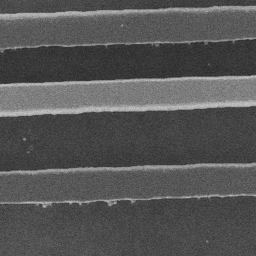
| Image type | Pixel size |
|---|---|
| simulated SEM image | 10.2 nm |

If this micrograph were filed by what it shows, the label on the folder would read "lines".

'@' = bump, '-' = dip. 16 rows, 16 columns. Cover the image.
-------------@@@
@@@@@@@@@@@@@@@@
@@@@@@@@@@@@@@@-
----------------
----------------
@@@@@@@@@@@@@@@@
@@@@@@@@@@@@@@@@
----------------
----------------
----------------
------@@@@@@@@@@
@@@@@@@@@@@@@@@@
@@@@@@@@--------
----------------
----------------
----------------